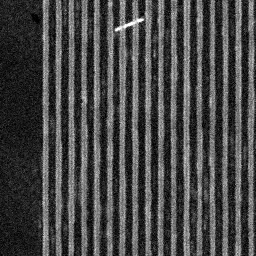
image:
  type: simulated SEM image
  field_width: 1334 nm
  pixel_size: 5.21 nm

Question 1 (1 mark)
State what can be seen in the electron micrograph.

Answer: parallel lines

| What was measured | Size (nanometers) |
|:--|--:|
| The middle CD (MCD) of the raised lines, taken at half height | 20.8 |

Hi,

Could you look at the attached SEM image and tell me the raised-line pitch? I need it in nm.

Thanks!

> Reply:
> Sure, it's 66.9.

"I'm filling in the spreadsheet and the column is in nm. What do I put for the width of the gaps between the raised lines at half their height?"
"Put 46.2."